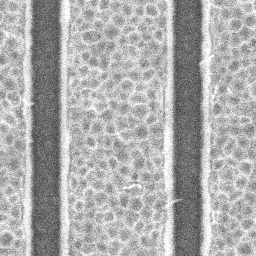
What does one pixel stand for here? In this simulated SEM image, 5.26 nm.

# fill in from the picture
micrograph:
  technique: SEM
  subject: one or a few lines or trenches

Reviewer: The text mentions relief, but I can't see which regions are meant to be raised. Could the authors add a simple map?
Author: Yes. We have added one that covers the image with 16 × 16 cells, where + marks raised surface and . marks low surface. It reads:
++..+++++++..+++
++..+++++++..+++
++..+++++++..+++
++..+++++++..+++
++..+++++++..+++
++..+++++++..+++
++..+++++++..+++
++..+++++++..+++
++..+++++++..+++
++..+++++++..+++
++..+++++++..+++
++..+++++++..+++
++..+++++++..+++
++..+++++++..+++
++..+++++++..+++
++..+++++++..+++